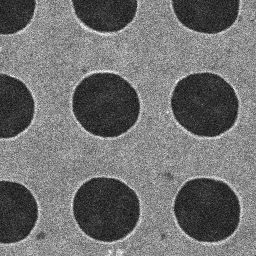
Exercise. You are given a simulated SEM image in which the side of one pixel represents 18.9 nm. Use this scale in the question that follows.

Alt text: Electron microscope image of holes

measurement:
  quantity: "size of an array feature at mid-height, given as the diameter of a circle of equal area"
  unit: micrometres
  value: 1.26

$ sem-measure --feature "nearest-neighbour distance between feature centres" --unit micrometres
1.89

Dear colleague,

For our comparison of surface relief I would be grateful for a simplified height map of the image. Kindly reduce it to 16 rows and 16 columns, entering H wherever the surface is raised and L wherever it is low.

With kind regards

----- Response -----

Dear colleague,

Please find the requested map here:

LLHHHLLLLHHLLLLH
LLHHHLLLHHHLLLLH
HHHHHHHHHHHHHHHH
HHHHHHHHHHHHHHHH
HHHHHHHHHHHHHHHH
LLHHHLLLHHHLLLLH
LLHHHLLLLHHLLLLH
LLHHHLLLLHHLLLLH
LHHHHHLHHHHHLLHH
HHHHHHHHHHHHHHHH
HHHHHHHHHHHHHHHH
LHHHHLLLHHHHLLHH
LLHHHLLLLHHLLLLH
LLHHHLLLLHHLLLLH
LLHHHLLLHHHHLLLH
HHHHHHHHHHHHHHHH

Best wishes